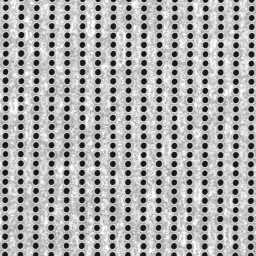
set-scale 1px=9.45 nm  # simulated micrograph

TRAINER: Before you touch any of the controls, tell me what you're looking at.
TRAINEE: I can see a regular array of holes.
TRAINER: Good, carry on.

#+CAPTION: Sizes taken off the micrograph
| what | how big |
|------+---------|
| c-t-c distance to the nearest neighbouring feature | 84.2 nm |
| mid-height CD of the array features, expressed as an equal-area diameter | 56.4 nm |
